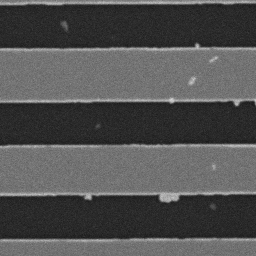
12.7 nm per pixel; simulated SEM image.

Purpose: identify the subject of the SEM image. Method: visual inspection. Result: lines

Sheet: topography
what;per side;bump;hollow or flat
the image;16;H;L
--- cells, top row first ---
LLLLLLLLLLLLLLLL
LLLLLLLLLLLLLLLL
LLLLLLLLLLLLLLLL
HHHHHHHHHHHHHHHH
HHHHHHHHHHHHHHHH
HHHHHHHHHHHHHHHH
LLLLLLLLLLLLLLLL
LLLLLLLLLLLLLLLL
LLLLLLLLLLLLLLLL
HHHHHHHHHHHHHHHH
HHHHHHHHHHHHHHHH
HHHHHHHHHHHHHHHH
LLLLLLLLLLLLLLLL
LLLLLLLLLLLLLLLL
LLLLLLLLLLLLLLLL
HHHHHHHHHHHHHHHH